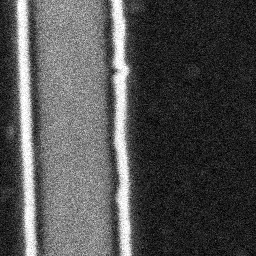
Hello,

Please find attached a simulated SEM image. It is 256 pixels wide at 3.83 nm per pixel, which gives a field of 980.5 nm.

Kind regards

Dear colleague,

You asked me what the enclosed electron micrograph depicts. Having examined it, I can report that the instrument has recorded one or a few lines or trenches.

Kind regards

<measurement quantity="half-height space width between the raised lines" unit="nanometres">359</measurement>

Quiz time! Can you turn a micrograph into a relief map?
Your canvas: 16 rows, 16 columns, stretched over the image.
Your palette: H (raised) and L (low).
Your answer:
HLLLLLLHHHHHHHHH
HLLLLLLHHHHHHHHH
HLLLLLLHHHHHHHHH
HLLLLLLHHHHHHHHH
HHLLLLLLHHHHHHHH
HHLLLLLHHHHHHHHH
HHLLLLLLHHHHHHHH
HHLLLLLHHHHHHHHH
HHLLLLLHHHHHHHHH
HHLLLLLLHHHHHHHH
HHLLLLLLHHHHHHHH
HHLLLLLLHHHHHHHH
HHLLLLLLHHHHHHHH
HHLLLLLLHHHHHHHH
HHLLLLLLHHHHHHHH
HHLLLLLLHHHHHHHH